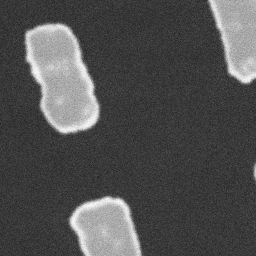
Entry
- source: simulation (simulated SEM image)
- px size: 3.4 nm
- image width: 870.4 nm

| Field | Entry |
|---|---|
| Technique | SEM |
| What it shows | raised bodies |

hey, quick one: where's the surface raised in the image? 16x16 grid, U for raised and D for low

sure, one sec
DDDDDDDDDDDDDUUU
DDDDDDDDDDDDDDUU
DDUUUDDDDDDDDDUU
DDUUUDDDDDDDDDUU
DDUUUDDDDDDDDDDU
DDDUUUDDDDDDDDDD
DDDUUUDDDDDDDDDD
DDDUUUDDDDDDDDDD
DDDDDDDDDDDDDDDD
DDDDDDDDDDDDDDDD
DDDDDDDDDDDDDDDD
DDDDDDDDDDDDDDDD
DDDDDDUDDDDDDDDD
DDDDDUUUDDDDDDDD
DDDDDUUUDDDDDDDD
DDDDDUUUUDDDDDDD